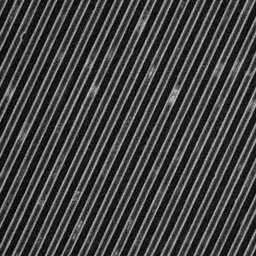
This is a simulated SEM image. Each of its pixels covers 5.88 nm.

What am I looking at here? parallel lines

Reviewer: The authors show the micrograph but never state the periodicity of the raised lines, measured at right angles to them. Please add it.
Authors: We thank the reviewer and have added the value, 88 nm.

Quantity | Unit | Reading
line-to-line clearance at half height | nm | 45.9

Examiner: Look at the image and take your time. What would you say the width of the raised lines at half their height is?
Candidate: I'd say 41.2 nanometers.